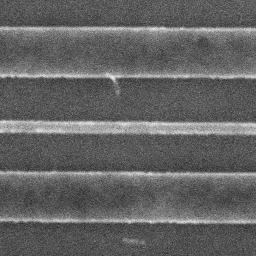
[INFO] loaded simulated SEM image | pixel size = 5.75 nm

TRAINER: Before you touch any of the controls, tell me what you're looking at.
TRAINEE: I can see lines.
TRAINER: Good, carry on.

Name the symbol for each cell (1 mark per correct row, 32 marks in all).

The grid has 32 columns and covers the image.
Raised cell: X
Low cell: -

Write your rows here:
--------------------------------
--------------------------------
--------------------------------
--------------------------------
XXXXXXXXXXXXXXXXXXXXXXXXXXXXXXXX
XXXXXXXXXXXXXXXXXXXXXXXXXXXXXXXX
XXXXXXXXXXXXXXXXXXXXXXXXXXXXXXXX
XXXXXXXXXXXXXXXXXXXXXXXXXXXXXXXX
XXXXXXXXXXXXXXXXXXXXXXXXXXXXXXXX
XXXXXXXXXXXXXXXXXXXXXXXXXXXXXXXX
--------------------------------
--------------------------------
--------------------------------
--------------------------------
--------------------------------
XXXXXXXXXXXXXXXXXXXXXXXXXXXXXXXX
--------XXXXXXXXXXXXXXXXXXXXXXXX
--------------------------------
--------------------------------
--------------------------------
--------------------------------
XXX---XX------------------------
XXXXXXXXXXXXXXXXXXXXXXXXXXXXXXXX
XXXXXXXXXXXXXXXXXXXXXXXXXXXXXXXX
XXXXXXXXXXXXXXXXXXXXXXXXXXXXXXXX
XXXXXXXXXXXXXXXXXXXXXXXXXXXXXXXX
XXXXXXXXXXXXXXXXXXXXXXXXXXXXXXXX
XXXXXXXXXXXXXXXXXXXXXXXXXXXXXXXX
--------------------------------
--------------------------------
--------------------------------
--------------------------------